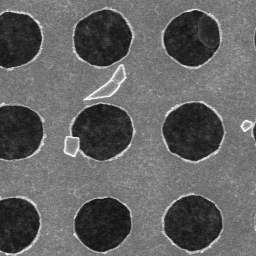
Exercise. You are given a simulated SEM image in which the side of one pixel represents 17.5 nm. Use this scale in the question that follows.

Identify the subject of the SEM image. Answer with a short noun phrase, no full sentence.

holes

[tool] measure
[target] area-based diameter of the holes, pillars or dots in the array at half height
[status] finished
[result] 1000 nm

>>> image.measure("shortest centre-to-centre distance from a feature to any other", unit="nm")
1580